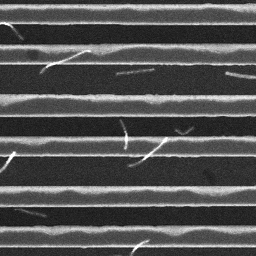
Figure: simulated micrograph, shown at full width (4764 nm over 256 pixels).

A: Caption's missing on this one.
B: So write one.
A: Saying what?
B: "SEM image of lines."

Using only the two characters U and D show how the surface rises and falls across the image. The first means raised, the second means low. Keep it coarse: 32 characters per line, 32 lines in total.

DDDDDDDDDDDDDDDDDDDDDDDDDDDDDDDD
UUUUUUUUUUUUUUUUUUUUUUUUUUUUUUUU
UUUUUUUUUUUUUUUUUUUUUUUUUUUUUUUU
DDDDDDDDDDDDDDDDDDDDDDDDDDDDDDDD
DDDDDDDDDDDDDDDDDDDDDDDDDDDDDDDD
DDDDDDDDDDDDDDDDDDDDDDDDDDDDDDDD
UUUUUUUUUUUUUUUUUUUUUUUUUUUUUUUU
UUUUUUUUUUUUUUUUUUUUUUUUUUUUUUUU
DDDDDDDDDDDDDDDDDDDDDDDDDDDDDDDD
DDDDDDDDDDDDDDDDDDDDDDDDDDDDDDDD
DDDDDDDDDDDDDDDDDDDDDDDDDDDDDDDD
DDDDDDDDDDDDDDDDDDDDDDDDDDDDDDDD
UUUUUUUUUUUUUUUUUUUUUUUUUUUUUUUU
UUUUUUUUUUUUUUUUUUUUUUUUUUUUUUUU
UUUUUUUUUUUUUUUUUUUUUUUUUUUUUUUD
DDDDDDDDDDDDDDDDDDDDDDDDDDDDDDDD
DDDDDDDDDDDDDDDDDDDDDDDDDDDDDDDD
UUUUUUUUUUUUUUUUUUUUUUUUUUUUUUUU
UUUUUUUUUUUUUUUUUUUUUUUUUUUUUUUU
DUDDDDDDDDDDDDDDUUUDDDUDUDDDDDDD
DDDDDDDDDDDDDDDDDDDDDDDDDDDDDDDD
DDDDDDDDDDDDDDDDDDDDDDDDDDDDDDDD
DDDDDDDDDDDDDDDDDDDDDDDDDDDDDDDD
UUUUUUUUUUUUUUUUUUUUUUUUUUDUUUUU
UUUUUUUUUUUUUUUUUUUUUUUUUUUUUUUU
UUUUUUUUUUUUUUUUUUUUUUUUUUUUUUUU
DDDDDDDDDDDDDDDDDDDDDDDDDDDDDDDD
DDDDDDDDDDDDDDDDDDDDDDDDDDDDDDDD
DUUUUDDDUUUDDUUUUUUUUDDUUUUUUDUU
UUUUUUUUUUUUUUUUUUUUUUUUUUUUUUUU
UUUUUUUUUUUUUUUUUUUUUUUUUUUUUUUU
DDDDDDDDDDDDDDDDDDDDDDDDDDDDDDDD